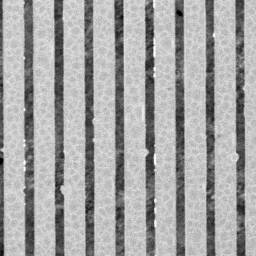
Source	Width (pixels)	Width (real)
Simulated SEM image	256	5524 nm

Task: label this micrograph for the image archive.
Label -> parallel lines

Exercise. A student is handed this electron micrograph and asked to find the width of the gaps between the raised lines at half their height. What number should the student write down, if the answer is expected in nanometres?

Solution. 210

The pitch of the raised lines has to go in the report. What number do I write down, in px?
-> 30.2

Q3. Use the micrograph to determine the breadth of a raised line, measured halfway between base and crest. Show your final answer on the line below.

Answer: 440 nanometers